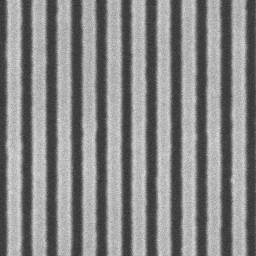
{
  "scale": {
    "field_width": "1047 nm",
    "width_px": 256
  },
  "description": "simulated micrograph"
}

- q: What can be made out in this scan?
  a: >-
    parallel lines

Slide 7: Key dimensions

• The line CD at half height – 0.0501 um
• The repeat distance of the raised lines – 102 nm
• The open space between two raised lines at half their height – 0.0501 microns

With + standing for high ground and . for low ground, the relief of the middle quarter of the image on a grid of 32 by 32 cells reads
++...+++...+++...+++....++....++
+....+++...+++...+++....++....++
+....+++...+++...+++...+++....++
++...+++...+++...+++...+++....++
++...+++...+++...+++...+++....++
++...+++...+++...+++...+++....++
++...+++...+++...+++...+++....++
++...+++...+++...+++...+++....++
+....+++...+++...+++....++....++
++...+++...+++...+++....++....++
++...+++...+++...+++....++....++
++...+++...+++...+++....++....++
+....+++...+++...+++...+++....++
+....+++...+++...+++....++....++
+....+++...+++...+++...+++....++
+....+++...+++...+++....++....++
++...+++...+++...+++...+++....++
+....+++...+++...+++...+++....++
+....++....+++...+++....++....++
++...+++...+++...+++...+++....++
++...+++...+++...+++....++....++
++...+++...+++...+++....++....++
++...+++...+++...+++....++....++
+....+++...+++...+++...+++....++
++...+++...+++...+++....++....++
++...+++...+++...+++....++....++
++...+++...+++...+++....++....++
++...+++...+++...+++....++....++
++...+++...+++...+++...+++....++
++...+++...+++...+++...+++....++
++...+++...+++...+++...+++....++
++...+++...+++...+++...+++....++